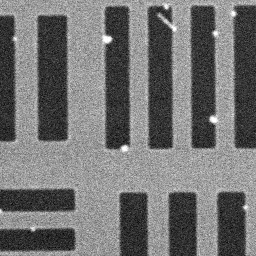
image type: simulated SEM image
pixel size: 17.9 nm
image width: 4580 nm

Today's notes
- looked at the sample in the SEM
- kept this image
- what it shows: groups of lines, slits or small figures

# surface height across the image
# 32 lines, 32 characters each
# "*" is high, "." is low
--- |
********************************
*************...**....**...**...
..**.....****...**....**...**...
..**.....****...**...***...**...
..**.....****...**....**...**...
..**.....****...**....**...**...
..**.....****...**....**...**...
..***....****...**....**...**...
..***....****...**....**...**...
..***....****...**....**...**...
..***....****...**....**...**...
..***....****...**....**...**...
..***....****...**....**...**...
..***....****...**....**...**...
..***....****...**....**...**...
..***....****...**....**...**...
..***....****...**....**...**...
..***...*****...**....**...**...
*************..****...**...***..
********************************
********************************
********************************
********************************
******...***********************
..........*****...***....**....*
..........*****....**....**....*
*........******....**....**....*
***************....**....**....*
*..**....******....**....**....*
..........*****....**....**....*
..........*****....**....**....*
.........******....**....**....*